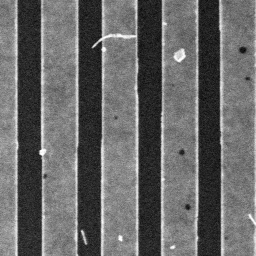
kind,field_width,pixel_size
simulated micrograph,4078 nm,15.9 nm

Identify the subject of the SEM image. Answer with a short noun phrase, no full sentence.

lines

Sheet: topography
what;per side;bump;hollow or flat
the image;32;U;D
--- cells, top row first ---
UUDDDUUUUUDDDUUUUDDDUUUUUDDUUUUU
UUDDDUUUUUDDDUUUUDDDUUUUUDDUUUUU
UUDDDUUUUUDDDUUUUDDDUUUUUDDDUUUU
UUDDDUUUUUDDDUUUUDDDUUUUUDDDUUUU
UUDDDUUUUUDDDUUUUDDDUUUUUDDDUUUU
UUDDDUUUUUDDDUUUUDDDUUUUUDDDUUUU
UUDDDUUUUUDDDUUUUDDDUUUUUDDDUUUU
UUDDDUUUUUDDDUUUUDDDUUUUUDDDUUUU
UUDDDUUUUUDDDUUUUDDDUUUUUDDDUUUU
UUDDDUUUUUDDDUUUUDDDUUUUUDDDUUUU
UUDDDUUUUUDDDUUUUDDDUUUUUDDDUUUU
UUDDDUUUUUDDDUUUUDDDUUUUUDDDUUUU
UUDDDUUUUUDDDUUUUDDDUUUUUDDDUUUU
UUDDDUUUUUDDDUUUUDDDUUUUUDDDUUUU
UUDDDUUUUUDDDUUUUDDDUUUUUDDDUUUU
UUDDDUUUUUDDDUUUUDDDUUUUUDDDUUUU
UUDDDUUUUUDDDUUUUDDDUUUUUDDDUUUU
UUDDDUUUUUDDDUUUUDDDUUUUUDDDUUUU
UUDDDUUUUUDDDUUUUDDDUUUUUDDDUUUU
UUDDDUUUUUDDDUUUUDDDUUUUUDDDUUUU
UUDDDUUUUUDDDUUUUDDDUUUUUDDDUUUU
UUDDDUUUUUDDDUUUUDDDUUUUUDDDUUUU
UUDDDUUUUUDDDUUUUDDDUUUUUDDDUUUU
UUDDDUUUUUDDDUUUUDDDUUUUUDDDUUUU
UUDDDUUUUUDDDUUUUDDDUUUUUDDDUUUU
UUDDDUUUUUDDDUUUUDDDUUUUUDDDUUUU
UUDDDUUUUUDDDUUUUDDDUUUUUDDDUUUU
UUDDDUUUUUDDDUUUUDDDUUUUUDDDUUUU
UUDDDUUUUUDDDUUUUDDDUUUUUDDDUUUU
UUDDDUUUUUDDDUUUUDDDUUUUUDDDUUUU
UUDDDUUUUUDDDUUUUDDDUUUUUDDDUUUU
UUDDDUUUUUDDDUUUUDDDUUUUUDDDUUUU